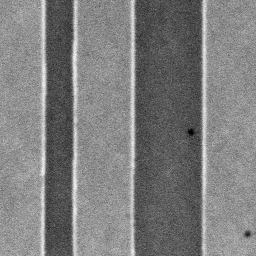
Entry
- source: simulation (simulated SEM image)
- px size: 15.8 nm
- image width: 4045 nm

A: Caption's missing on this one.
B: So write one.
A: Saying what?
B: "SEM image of lines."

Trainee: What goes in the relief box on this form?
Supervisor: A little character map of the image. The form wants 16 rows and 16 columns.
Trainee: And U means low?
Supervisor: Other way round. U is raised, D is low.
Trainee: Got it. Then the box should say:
UUUDDUUUDDDDDUUU
UUUDDUUUDDDDDUUU
UUUDDUUUDDDDDUUU
UUUDDUUUDDDDDUUU
UUUDDUUUDDDDDUUU
UUUDDUUUDDDDDUUU
UUUDDUUUDDDDDUUU
UUUDDUUUDDDDDUUU
UUUDDUUUDDDDDUUU
UUUDDUUUDDDDDUUU
UUUDDUUUDDDDDUUU
UUUDDUUUDDDDDUUU
UUUDDUUUDDDDDUUU
UUUDDUUUDDDDDUUU
UUUDDUUUDDDDDUUU
UUUDDUUUDDDDDUUU